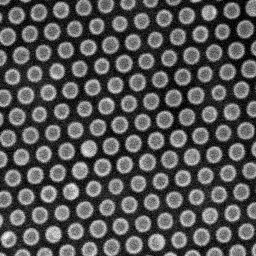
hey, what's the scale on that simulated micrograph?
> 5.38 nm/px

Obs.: a regular array of raised bodies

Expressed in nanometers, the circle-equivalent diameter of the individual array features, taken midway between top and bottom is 82.2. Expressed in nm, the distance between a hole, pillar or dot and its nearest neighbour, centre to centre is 120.